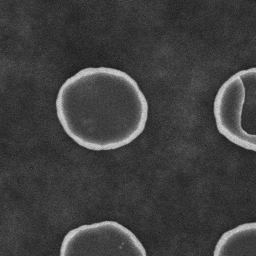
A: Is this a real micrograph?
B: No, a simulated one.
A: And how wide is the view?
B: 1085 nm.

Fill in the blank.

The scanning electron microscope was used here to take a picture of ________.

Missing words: raised bodies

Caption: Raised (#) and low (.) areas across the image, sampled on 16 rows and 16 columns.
................
................
................
................
.....##........#
....#####.....##
....#####.....##
....#####.....##
.....###......##
................
................
................
................
................
.....###......##
....#####.....##